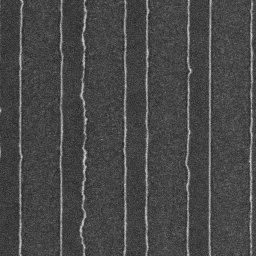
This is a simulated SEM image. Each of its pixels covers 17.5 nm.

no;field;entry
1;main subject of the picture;one or a few lines or trenches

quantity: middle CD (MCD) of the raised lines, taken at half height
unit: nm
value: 393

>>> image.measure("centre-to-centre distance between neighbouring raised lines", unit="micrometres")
1.1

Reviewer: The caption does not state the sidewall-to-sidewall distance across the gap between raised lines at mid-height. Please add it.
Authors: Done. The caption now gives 712 nm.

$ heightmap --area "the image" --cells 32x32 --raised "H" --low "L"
HHHLLLLLHHHLLLLLHHLLLLLLHHLLLLLL
HHHLLLLLHHHLLLLLHHHLLLLLHHLLLLLH
HHHLLLLLHHHLLLLLHHLLLLLLHHLLLLLH
HHHLLLLLHHHLLLLLHHLLLLLLHHLLLLLH
HHHLLLLLHHLLLLLLHHLLLLLLHHLLLLLH
HHHLLLLLHHHLLLLLHHLLLLLLHHLLLLLH
HHHLLLLLHHHLLLLLHHLLLLLLHHLLLLLL
HHHLLLLLHHHLLLLLHHLLLLLLHHLLLLLL
HHHLLLLLHHHLLLLLHHLLLLLLHHLLLLLL
HHHLLLLLHHLLLLLLHHLLLLLLHHLLLLLL
HHHLLLLLHHLLLLLLHHLLLLLLHHLLLLLL
HHHLLLLLHHLLLLLLHHLLLLLLHHLLLLLH
HHHLLLLLHHLLLLLLHHLLLLLLHHLLLLLH
HHHLLLLLHHHLLLLLHHLLLLLLHHLLLLLH
HHHLLLLLHHHLLLLLHHLLLLLLHHLLLLLH
HHHLLLLLHHHLLLLLHHLLLLLLHHLLLLLH
HHHLLLLLHHHLLLLLHHLLLLLLHHLLLLLH
HHHLLLLLHHHLLLLLHHLLLLLHHHLLLLLH
HHHLLLLLHHHLLLLLHHLLLLLHHHLLLLLH
HHHLLLLLHHHLLLLLHHLLLLLHHHLLLLLH
HHHLLLLLHHHLLLLLHHLLLLLHHHLLLLLH
HHLLLLLLHHHLLLLLHHLLLLLLHHLLLLLH
HHLLLLLLHHHLLLLLHHLLLLLLHHLLLLLH
HHLLLLLLHHLLLLLLHHLLLLLHHHLLLLLH
HHHLLLLLHHLLLLLLHHLLLLLLHHLLLLLH
HHHLLLLLHHLLLLLLHHLLLLLHHHLLLLLH
HHHLLLLLHHHLLLLLHHLLLLLHHHLLLLLH
HHHLLLLLHHHLLLLLHHLLLLLLHHLLLLLH
HHHLLLLLHHLLLLLLHHLLLLLHHHLLLLLH
HHLLLLLLHHLLLLLLHHLLLLLHHHLLLLLH
HHHLLLLLHHLLLLLLHHLLLLLHHHLLLLLH
HHLLLLLLHHHLLLLLHHLLLLLHHHLLLLLH